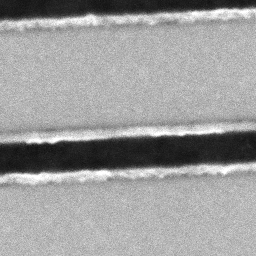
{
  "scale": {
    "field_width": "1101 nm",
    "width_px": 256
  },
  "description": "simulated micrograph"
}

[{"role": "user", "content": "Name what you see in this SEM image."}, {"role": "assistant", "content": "one or a few lines or trenches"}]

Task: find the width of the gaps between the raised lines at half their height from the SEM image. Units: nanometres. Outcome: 480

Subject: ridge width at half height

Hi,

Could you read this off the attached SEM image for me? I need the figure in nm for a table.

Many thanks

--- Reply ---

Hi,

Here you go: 183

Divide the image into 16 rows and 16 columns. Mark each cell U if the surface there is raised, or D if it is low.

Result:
UUUUUUUUUUUUUUUU
UUDUDDDDDDDDDDDD
DDDDDDDDDDDDDDDD
DDDDDDDDDDDDDDDD
DDDDDDDDDDDDDDDD
DDDDDDDDDDDDDDDD
DDDDDDDDDDDDDDDD
DDDDDDDDDDDDDDDD
DDUUUUUUUUUUUUUU
UUUUUUUUUUUUUUUU
UUUUUUUUUUUUUUUU
DDDDDDDDDDDDDDDD
DDDDDDDDDDDDDDDD
DDDDDDDDDDDDDDDD
DDDDDDDDDDDDDDDD
DDDDDDDDDDDDDDDD